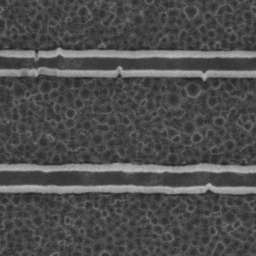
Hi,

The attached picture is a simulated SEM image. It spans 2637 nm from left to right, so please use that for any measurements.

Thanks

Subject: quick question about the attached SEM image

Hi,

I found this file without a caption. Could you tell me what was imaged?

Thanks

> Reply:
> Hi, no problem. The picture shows one or a few lines or trenches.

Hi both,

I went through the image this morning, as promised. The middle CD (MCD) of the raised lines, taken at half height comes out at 215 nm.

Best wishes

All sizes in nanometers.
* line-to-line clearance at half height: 972